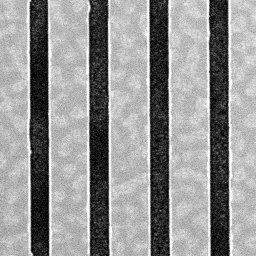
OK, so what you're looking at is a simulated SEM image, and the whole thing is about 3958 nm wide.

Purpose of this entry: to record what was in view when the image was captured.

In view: parallel lines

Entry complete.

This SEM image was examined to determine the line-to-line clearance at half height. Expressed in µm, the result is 0.313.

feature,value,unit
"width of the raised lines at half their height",612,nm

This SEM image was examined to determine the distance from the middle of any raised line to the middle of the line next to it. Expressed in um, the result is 0.928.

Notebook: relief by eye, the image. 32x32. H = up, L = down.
HHHHLLHHHHHLLLHHHHHLLHHHHHLLLHHH
HHHHLLHHHHHLLLHHHHLLLHHHHHLLLHHH
HHHHLLHHHHHLLLHHHHLLLHHHHHLLLHHH
HHHHLLHHHHHLLLHHHHHLLHHHHHLLLHHH
HHHHLLHHHHHLLLHHHHHLLHHHHHLLLHHH
HHHHLLHHHHHLLLHHHHHLLHHHHHLLLHHH
HHHHLLHHHHHLLLHHHHHLLHHHHHLLLHHH
HHHHLLHHHHHLLLHHHHHLLHHHHHLLLHHH
HHHHLLHHHHHLLLHHHHHLLHHHHHLLLHHH
HHHHLLHHHHHLLLHHHHHLLHHHHHLLLHHH
HHHHLLHHHHHLLLHHHHHLLHHHHHLLLHHH
HHHHLLHHHHHLLLHHHHHLLHHHHHLLLHHH
HHHHLLHHHHHLLLHHHHHLLHHHHHLLLHHH
HHHHLLHHHHHLLLHHHHHLLHHHHHLLLHHH
HHHHLLHHHHHLLLHHHHHLLHHHHHLLLHHH
HHHHLLHHHHHLLLHHHHHLLHHHHHLLLHHH
HHHLLLHHHHHLLLHHHHHLLHHHHHLLLHHH
HHHHLLHHHHHLLLHHHHHLLHHHHHLLLHHH
HHHHLLHHHHHLLLHHHHHLLHHHHHLLLHHH
HHHHLLHHHHHLLLHHHHHLLHHHHHLLLHHH
HHHHLLHHHHHLLLHHHHHLLHHHHHLLLHHH
HHHHLLHHHHHLLLHHHHHLLHHHHHLLLHHH
HHHHLLHHHHHLLLHHHHHLLHHHHHLLLHHH
HHHHLLHHHHHLLLHHHHHLLHHHHHLLLHHH
HHHHLLHHHHHLLLHHHHHLLHHHHHLLLHHH
HHHHLLHHHHHLLLHHHHHLLHHHHHLLLHHH
HHHHLLHHHHHLLLHHHHHLLHHHHHLLLHHH
HHHHLLHHHHHLLLHHHHHLLHHHHHLLLHHH
HHHHLLHHHHHLLLHHHHHLLHHHHHLLLHHH
HHHHLLHHHHHLLLHHHHHLLHHHHHLLLHHH
HHHHLLHHHHHLLLHHHHHLLHHHHHLLLHHH
HHHHLLHHHHHLLLHHHHHLLHHHHHLLLHHH